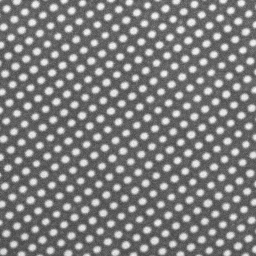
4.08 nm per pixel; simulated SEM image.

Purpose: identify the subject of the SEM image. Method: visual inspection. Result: a regular array of raised bodies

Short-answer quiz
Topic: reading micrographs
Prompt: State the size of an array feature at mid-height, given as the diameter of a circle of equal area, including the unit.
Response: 27.6 nanometers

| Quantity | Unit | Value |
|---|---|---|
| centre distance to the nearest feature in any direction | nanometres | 52.4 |